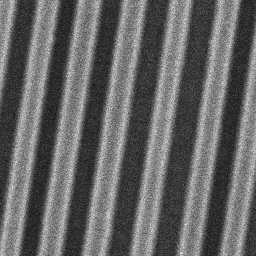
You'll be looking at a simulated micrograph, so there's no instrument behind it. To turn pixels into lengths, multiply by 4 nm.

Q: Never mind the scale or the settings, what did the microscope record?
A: parallel lines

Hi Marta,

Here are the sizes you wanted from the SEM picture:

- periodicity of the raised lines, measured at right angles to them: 0.178 micrometres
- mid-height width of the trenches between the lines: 86.4 nm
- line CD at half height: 86.4 nm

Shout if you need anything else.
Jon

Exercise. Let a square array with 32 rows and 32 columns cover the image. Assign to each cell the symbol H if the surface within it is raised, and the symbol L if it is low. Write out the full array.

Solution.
HHLLLHHLLLHHHLLHHHLLLHHHLLLHHHLL
HHLLHHHLLLHHLLLHHHLLLHHHLLLHHHLL
HHLLHHHLLHHHLLLHHHLLLHHHLLLHHHLL
HLLLHHHLLHHHLLLHHHLLLHHLLLLHHLLL
HLLLHHHLLHHHLLLHHHLLLHHLLLLHHLLL
HLLLHHHLLHHHLLHHHLLLLHHLLLHHHLLL
HLLLHHLLLHHHLLHHHLLLHHHLLLHHHLLH
HLLLHHLLHHHHLLHHHLLLHHHLLLHHHLLH
HLLHHHLLHHHLLLHHHLLLHHHLLLHHHLLH
LLLHHHLLHHHLLLHHHLLLHHLLLLHHLLLH
LLLHHHLLHHHLLLHHHLLLHHLLLLHHLLLH
LLLHHHLLHHHLLLHHLLLLHHLLLLHHLLLH
LLLHHLLLHHHLLHHHLLLHHHLLLHHHLLLH
LLLHHLLLHHHLLHHHLLLHHHLLLHHHLLHH
LLHHHLLLHHLLLHHHLLLHHHLLLHHHLLHH
LLHHHLLHHHLLLHHHLLLHHHLLLHHHLLHH
LLHHHLLHHHLLLHHHLLLHHLLLLHHLLLHH
LLHHHLLHHHLLLHHHLLLHHLLLLHHLLLHH
LLHHLLLHHHLLLHHLLLLHHLLLHHHLLLHH
LLHHLLLHHHLLHHHLLLHHHLLLHHHLLHHH
LHHHLLLHHLLLHHHLLLHHHLLLHHHLLHHH
LHHHLLHHHLLLHHHLLLHHHLLLHHHLLHHH
LHHHLLHHHLLLHHHLLLHHLLLLHHHLLHHH
LHHHLLHHHLLLHHHLLLHHLLLLHHLLLHHL
LHHHLLHHHLLHHHLLLLHHLLLHHHLLLHHL
LHHLLLHHHLLHHHLLLHHHLLLHHHLLHHHL
LHHLLLHHLLLHHHLLLHHHLLLHHHLLHHHL
HHHLLHHHLLLHHHLLLHHHLLLHHHLLHHHL
HHHLLHHHLLLHHHLLLHHLLLLHHHLLHHHL
HHHLLHHHLLLHHHLLLHHLLLLHHLLLHHHL
HHHLLHHHLLLHHLLLLHHLLLLHHLLLHHLL
HHLLLHHHLLHHHLLLHHHLLLHHHLLLHHLL